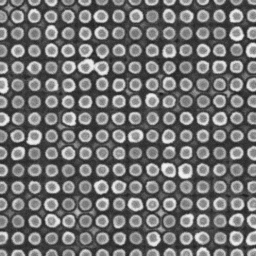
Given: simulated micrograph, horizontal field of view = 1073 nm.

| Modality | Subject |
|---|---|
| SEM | a regular array of raised bodies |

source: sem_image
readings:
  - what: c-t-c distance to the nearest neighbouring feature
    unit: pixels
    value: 16.5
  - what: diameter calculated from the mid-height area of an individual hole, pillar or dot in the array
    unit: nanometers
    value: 50.5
